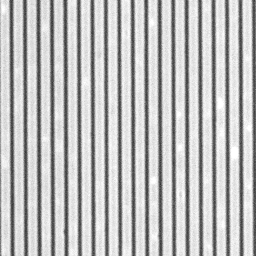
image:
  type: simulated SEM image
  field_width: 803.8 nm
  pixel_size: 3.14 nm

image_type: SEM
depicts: parallel lines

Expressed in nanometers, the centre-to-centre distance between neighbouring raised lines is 42.4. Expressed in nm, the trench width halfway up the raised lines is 16.1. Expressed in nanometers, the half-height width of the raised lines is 26.7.